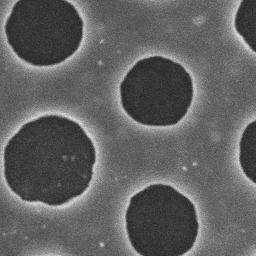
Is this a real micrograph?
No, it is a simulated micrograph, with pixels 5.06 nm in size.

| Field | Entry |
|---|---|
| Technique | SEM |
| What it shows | holes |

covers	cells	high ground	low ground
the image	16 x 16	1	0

1000011111111110
0000011111111110
1000011111111110
1000111111111111
1111111100001111
1111111100001111
1111111100001111
1100111100011111
1000011111111110
0000001111111110
0000001111111110
1000001111111111
1100111100001111
1111111100001111
1111111100001111
1111111100001111